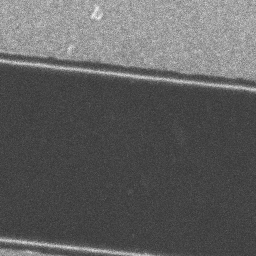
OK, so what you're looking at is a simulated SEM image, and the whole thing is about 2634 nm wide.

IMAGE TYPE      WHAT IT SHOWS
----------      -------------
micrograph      one or a few lines or trenches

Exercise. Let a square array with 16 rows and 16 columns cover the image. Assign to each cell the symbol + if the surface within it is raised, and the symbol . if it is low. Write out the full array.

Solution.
................
................
................
................
++++++..........
+++++++++++++++.
++++++++++++++++
++++++++++++++++
++++++++++++++++
++++++++++++++++
++++++++++++++++
++++++++++++++++
++++++++++++++++
++++++++++++++++
++++++++++++++++
.....+++++++++++